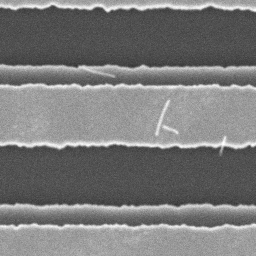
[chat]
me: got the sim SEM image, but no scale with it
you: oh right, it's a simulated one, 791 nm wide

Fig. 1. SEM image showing lines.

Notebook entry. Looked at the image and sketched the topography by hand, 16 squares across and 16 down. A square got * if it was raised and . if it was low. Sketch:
.....****..*..**
................
................
................
................
****************
****************
****************
****************
................
................
................
................
................
****************
****************